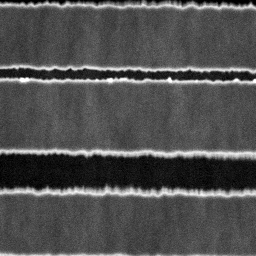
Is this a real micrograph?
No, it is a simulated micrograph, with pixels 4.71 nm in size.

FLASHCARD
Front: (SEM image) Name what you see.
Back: lines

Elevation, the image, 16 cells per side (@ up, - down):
@@@@@@@@@@@@@@@@
@@@@@@@@@@@@@@@@
@@@@@@@@@@@@@@@@
@@@@@@@@@@@@@@@@
@@@@@@@@@@@@@@@@
@@@@@@@@@@@@@@@@
@@@@@@@@@@@@@@@@
@@@@@@@@@@@@@@@@
@@@@@@@@@@@@@@@@
----@@@@@@@@@@@@
----------------
----------------
@@@@@@@@@@@@@@@@
@@@@@@@@@@@@@@@@
@@@@@@@@@@@@@@@@
@@@@@@@@@@@@@@@@